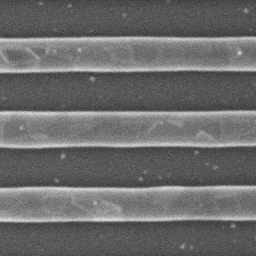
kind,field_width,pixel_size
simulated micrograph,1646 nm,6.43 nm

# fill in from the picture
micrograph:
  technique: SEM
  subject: wiring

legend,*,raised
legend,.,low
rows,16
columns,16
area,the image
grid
................
................
****************
****************
................
................
................
****************
****************
................
................
................
****************
****************
................
................